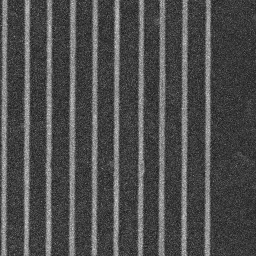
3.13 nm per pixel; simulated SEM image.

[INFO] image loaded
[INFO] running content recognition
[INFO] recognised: parallel lines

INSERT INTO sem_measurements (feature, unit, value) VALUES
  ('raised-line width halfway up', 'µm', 0.0133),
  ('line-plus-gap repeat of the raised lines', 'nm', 70.8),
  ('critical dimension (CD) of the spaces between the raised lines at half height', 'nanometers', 58.7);